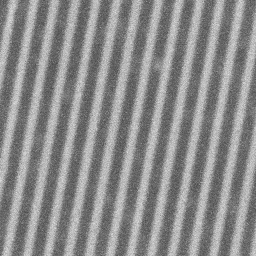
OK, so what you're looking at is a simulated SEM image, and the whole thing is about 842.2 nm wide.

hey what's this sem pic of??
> parallel lines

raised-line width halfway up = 20.2 nm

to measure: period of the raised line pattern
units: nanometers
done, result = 66.9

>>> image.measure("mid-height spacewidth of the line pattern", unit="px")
13.9